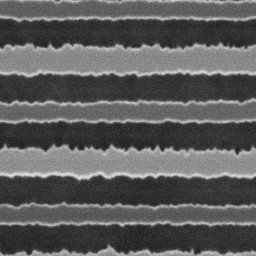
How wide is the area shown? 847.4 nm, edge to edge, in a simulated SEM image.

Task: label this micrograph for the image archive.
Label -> lines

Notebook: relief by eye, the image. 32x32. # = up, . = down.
################################
################################
..###.##......#..........#..###.
................................
................................
................................
################################
################################
################################
...#............................
................................
................................
...............................#
################################
################################
................................
................................
................................
#.....###.....#.................
################################
################################
################################
................................
................................
................................
...##..#........................
################################
################################
................................
................................
................................
....#.......###..##..##..##.....